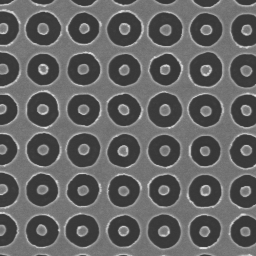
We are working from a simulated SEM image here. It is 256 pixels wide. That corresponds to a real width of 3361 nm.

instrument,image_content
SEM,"a regular array of ring-shaped grooves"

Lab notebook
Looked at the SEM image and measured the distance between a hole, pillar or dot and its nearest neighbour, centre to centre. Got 0.526 microns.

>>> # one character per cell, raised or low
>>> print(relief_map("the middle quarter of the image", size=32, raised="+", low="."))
+...++...++...++...+++..++...++.
+...++...++...++...++...+++..++.
+...+....++...++...+++...+...++.
+.......++++.......+++.......+++
++.....+++++......+++++.....++++
+++++++++++++++++++++++++.++++++
++++++++++++++++++++++++++++++++
++++..++++++++++++++++++...+++++
++......++++......++++......++++
+........++........++........+++
+...++...++...++...++...++...++.
+...++...++...++...++...++....+.
+...++...++....+...++...++....+.
+.......++++.......++........+++
+++....+++++......++++......++++
++++++++++++++..+++++++....+++++
++++++++++++++++++++++++++++++++
++++..+++++++++.++++++++++++++++
++......+++++.....+++++....+++++
+........+++......++++.......+++
+...++...++...++...++........+++
+...++...++...++...++...++...+++
+...++...++...++...++...++...+++
+.......+++.......+++........+++
++......++++......++++......++++
+++....++++++...++++++++..++++++
++++++++++++++++++++++++++++++++
++++.+++++++++++++++++++++++++++
++.....++++++....++++++.....++++
++......++++......++++.......+++
+...+....++........++...++...++.
+..+++...++...++...++...++...++.